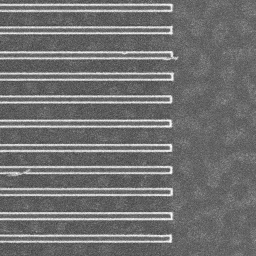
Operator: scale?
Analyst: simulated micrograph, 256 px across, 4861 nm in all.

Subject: parallel lines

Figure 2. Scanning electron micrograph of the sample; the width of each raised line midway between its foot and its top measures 0.114 um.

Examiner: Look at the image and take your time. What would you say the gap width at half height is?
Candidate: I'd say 320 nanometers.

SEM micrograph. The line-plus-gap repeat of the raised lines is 438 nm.